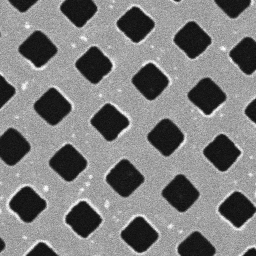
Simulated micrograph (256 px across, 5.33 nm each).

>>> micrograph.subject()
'a regular array of holes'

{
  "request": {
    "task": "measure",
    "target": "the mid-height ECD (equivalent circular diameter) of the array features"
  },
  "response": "180 nm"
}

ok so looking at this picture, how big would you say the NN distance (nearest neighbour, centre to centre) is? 308 nanometers